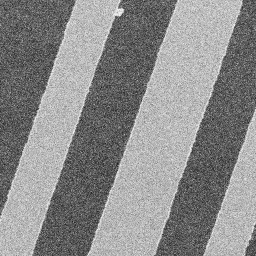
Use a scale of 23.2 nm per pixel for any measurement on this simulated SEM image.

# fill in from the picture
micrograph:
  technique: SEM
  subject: one or a few lines or trenches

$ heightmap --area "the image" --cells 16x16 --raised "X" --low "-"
-----XX----XXXX-
----XXX----XXXX-
----XXX---XXXX--
----XX----XXXX--
---XXX----XXXX--
---XXX---XXXX---
---XX----XXXX---
--XXX----XXXX---
--XXX---XXXX---X
-XXX----XXXX---X
-XXX---XXXXX---X
-XXX---XXXX---XX
XXX----XXXX---XX
XXX---XXXX----XX
XX----XXXX---XXX
XX----XXXX---XX-